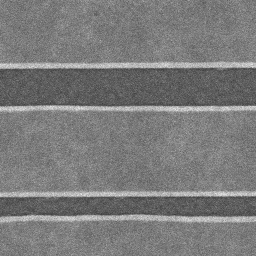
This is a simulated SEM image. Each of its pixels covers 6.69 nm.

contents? one or a few lines or trenches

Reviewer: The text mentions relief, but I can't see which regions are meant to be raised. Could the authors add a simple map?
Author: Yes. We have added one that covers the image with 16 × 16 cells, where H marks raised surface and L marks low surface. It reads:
HHHHHHHHHHHHHHHH
HHHHHHHHHHHHHHHH
HHHHHHHHHHHHHHHH
HHHHHHHHHHHHHHHH
LLLLLLLLLLLLLLLL
LLLLLLLLLLLLLLLL
LLLLLLLLLLLLLLLL
HHHHHHHHHHHHHHHH
HHHHHHHHHHHHHHHH
HHHHHHHHHHHHHHHH
HHHHHHHHHHHHHHHH
HHHHHHHHHHHHHHHH
LLLLLLLLLLLLLLLL
LLLLLLLLLLLLLLLL
HHHHHHHHHHHHHHHH
HHHHHHHHHHHHHHHH